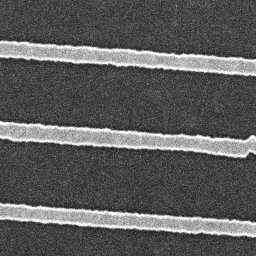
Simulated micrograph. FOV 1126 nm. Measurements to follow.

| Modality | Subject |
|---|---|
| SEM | one or a few lines or trenches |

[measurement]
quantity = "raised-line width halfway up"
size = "64.1 nm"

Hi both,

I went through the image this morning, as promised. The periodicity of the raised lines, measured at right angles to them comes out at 356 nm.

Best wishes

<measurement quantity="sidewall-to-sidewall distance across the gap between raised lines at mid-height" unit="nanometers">293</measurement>